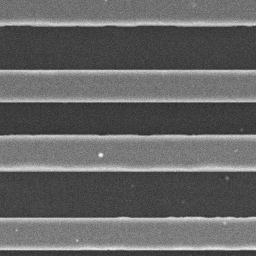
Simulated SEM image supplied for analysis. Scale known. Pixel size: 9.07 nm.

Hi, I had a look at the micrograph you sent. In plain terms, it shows lines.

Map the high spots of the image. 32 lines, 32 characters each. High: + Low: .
++++++++++++++++++++++++++++++++
++++++++++++++++++++++++++++++++
++++++++++++++++++++++++++++++++
................................
................................
................................
................................
................................
................................
++++++++++++++++++++++++++++++++
++++++++++++++++++++++++++++++++
++++++++++++++++++++++++++++++++
++++++++++++++++++++++++++++++++
................................
................................
................................
................................
++++++++++++++++++++++++++++++++
++++++++++++++++++++++++++++++++
++++++++++++++++++++++++++++++++
++++++++++++++++++++++++++++++++
................................
................................
................................
................................
................................
................................
++++++++++++++++++++++++++++++++
++++++++++++++++++++++++++++++++
++++++++++++++++++++++++++++++++
++++++++++++++++++++++++++++++++
................................